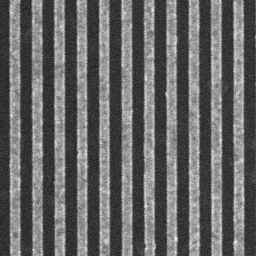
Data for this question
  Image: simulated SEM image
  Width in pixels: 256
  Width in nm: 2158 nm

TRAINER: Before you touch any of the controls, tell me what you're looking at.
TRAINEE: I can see parallel lines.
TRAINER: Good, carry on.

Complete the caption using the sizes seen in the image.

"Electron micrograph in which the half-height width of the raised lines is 0.0759 µm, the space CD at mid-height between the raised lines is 0.112 microns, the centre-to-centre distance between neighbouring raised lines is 189 nm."